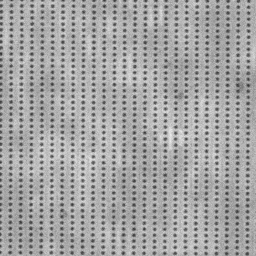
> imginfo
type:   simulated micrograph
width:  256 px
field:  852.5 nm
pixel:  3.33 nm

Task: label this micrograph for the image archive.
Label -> a regular array of holes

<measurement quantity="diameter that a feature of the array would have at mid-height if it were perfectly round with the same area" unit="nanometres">11.9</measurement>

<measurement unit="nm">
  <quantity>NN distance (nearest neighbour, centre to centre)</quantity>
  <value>19.8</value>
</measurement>